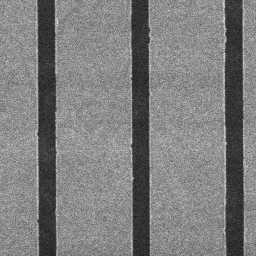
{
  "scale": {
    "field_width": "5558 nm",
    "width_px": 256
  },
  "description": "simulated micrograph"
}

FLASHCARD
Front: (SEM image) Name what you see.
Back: one or a few lines or trenches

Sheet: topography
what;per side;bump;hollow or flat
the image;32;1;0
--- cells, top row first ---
11111001111111110001111111110011
11111001111111110001111111110001
11111001111111110001111111110001
11111001111111110001111111110001
11111001111111110001111111110001
11111001111111110001111111110001
11111001111111110001111111110001
11111001111111110001111111110001
11111001111111110001111111110001
11111001111111110001111111110001
11111001111111110001111111110001
11111001111111110001111111110001
11111001111111110001111111110001
11111001111111110001111111110001
11111001111111110001111111110001
11111001111111110001111111110001
11111001111111110001111111110001
11111001111111110001111111110001
11111001111111110001111111110001
11111001111111110001111111110001
11111001111111110001111111110001
11111001111111110001111111110001
11111001111111111001111111110001
11111001111111110001111111110001
11111001111111110001111111110001
11111001111111110001111111110001
11111001111111111001111111110001
11111001111111111001111111110001
11111001111111111001111111110001
11111001111111111001111111110001
11111001111111111001111111110001
11111001111111110001111111110001